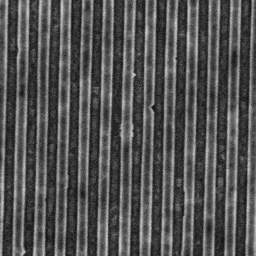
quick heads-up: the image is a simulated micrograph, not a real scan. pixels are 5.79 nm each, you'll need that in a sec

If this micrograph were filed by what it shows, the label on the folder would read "parallel lines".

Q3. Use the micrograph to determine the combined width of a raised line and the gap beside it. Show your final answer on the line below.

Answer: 122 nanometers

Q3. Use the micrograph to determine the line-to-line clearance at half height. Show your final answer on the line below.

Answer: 0.0665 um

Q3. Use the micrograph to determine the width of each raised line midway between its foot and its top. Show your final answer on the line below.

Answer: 0.0549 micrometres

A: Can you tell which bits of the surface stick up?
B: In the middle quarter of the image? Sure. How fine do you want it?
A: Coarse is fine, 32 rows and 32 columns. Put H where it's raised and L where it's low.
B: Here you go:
HLLLHHLLLLHHLLLHHLLLHHLLLLHHLLLH
HLLLHHLLLLHHLLLHHLLLHHLLLLHHLLLH
HLLLHHLLLLHHLLLHHLLLHHLLLHHHLLLH
HLLLHHLLLLHHLLLHHLLLHHLLLHHHLLLH
HLLLHHLLLLHHLLLHHLLLHHLLLHHHLLLH
HLLLHHLLLLHHLLLHHLLLHHLLLHHHLLLH
HLLLHHLLLLHHLLLHHLLLHHLLLHHHLLLH
HLLLHHLLLLHHLLLHHLLLHHLLLHHHLLLH
HLLLHHLLLLHHLLLHHLLLHHLLLHHLLLLH
HLLLHHLLLLHHLLLHHLLLHHLLLHHLLLLH
HLLLHHLLLLHHLLLHHLLLHHLLLHHLLLLH
HLLLHHLLLLHHLLLHHLLLHHLLLHHLLLLH
HLLLHHLLLHHHLLLHHLLLHHLLLHHLLLLH
HLLLHHLLLHHHLLLHHLLLHHLLLHHLLLLH
HLLLHHLLLHHHLLLHHLLLHHLLLHHLLLLH
HLLLHHLLLHHLLLHHHLLLHHLLLHHLLLLH
HLLLHHLLLHHLLLHHHLLLHHLLLHHLLLLH
HLLLHHLLLHHLLLHHHLLLHHLLLHHLLLLH
HLLLHHLLLHHLLLLHHLLLHHLLLHHLLLLH
HLLLHHLLLHHLLLLHHLLLHHLLLHHLLLLH
HLLLHHLLLHHLLLLHHLLLHHLLLHHLLLLH
HLLLHHLLLHHLLLLHHLLLHHLLLHHLLLLH
HLLLHHLLLHHLLLHHHLLLHHLLLHHLLLHH
HLLLHHLLLHHLLLHHHLLLHHLLLHHLLLHH
HLLLHHLLLHHLLLHHHLLLHHLLLHHLLLHH
HLLLHHLLLHHLLLHHHLLLHHLLLHHLLLHH
HLLLHHLLLHHLLLHHHLLLHHLLLHHLLLHH
HLLLHHLLLHHLLLHHHLLLHHLLLHHLLLHH
HLLLHHLLLHHLLLHHHLLLHHLLLHHLLLHH
HLLLHHLLLHHLLLHHLLLLHHLLLHHLLLHH
HLLLHHLLLHHLLLHHLLLLHHLLLHHLLLHH
LLLLHHLLLHHLLLHHLLLLHHLLLHHLLLHH